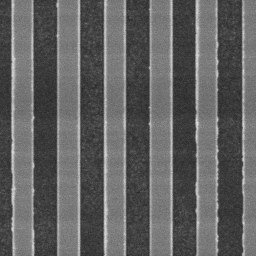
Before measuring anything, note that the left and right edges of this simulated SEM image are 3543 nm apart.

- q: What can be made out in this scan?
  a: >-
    lines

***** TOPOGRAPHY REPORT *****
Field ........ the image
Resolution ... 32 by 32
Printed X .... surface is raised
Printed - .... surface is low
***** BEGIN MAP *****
--XX---XXX---XXX---XX----XX---XX
--XX---XXX---XXX---XX----XX---XX
--XX---XXX---XXX---XX----XX---XX
--XX---XXX---XXX---XX----XX---XX
--XX---XXX---XXX---XX----XX---XX
--XX---XXX---XXX---XX----XX---XX
--XX---XXX---XXX---XX----XX---XX
--XX---XXX---XXX---XX----XX---XX
--XX---XXX---XXX---XX----XX---XX
--XX---XXX---XXX---XX----XX---XX
--XX---XXX---XXX---XX----XX---XX
--XX---XXX---XXX---XX----XX---XX
--XX---XXX---XXX---XX----XX---XX
--XX---XXX---XXX---XX----XX---XX
--XX---XXX---XXX---XX----XX---XX
--XX---XXX---XXX---XX----XX---XX
--XX---XXX---XXX---XX----XX---XX
--XX---XXX---XXX---XX----XX---XX
--XX---XXX---XXX---XX----XX---XX
--XX---XXX---XXX---XX----XX---XX
--XX---XXX---XXX---XX----XX---XX
--XX---XXX---XXX---XX----XX---XX
--XX---XXX---XXX---XX----XX---XX
--XX---XXX---XXX---XX----XX---XX
--XX---XXX---XXX---XX----XX---XX
--XX---XXX---XXX---XX----XX---XX
--XX---XXX---XXX---XX----XX---XX
--XX---XXX---XXX---XX----XX---XX
--XX---XXX---XXX---XX----XX---XX
--XX---XXX---XXX---XX----XX---XX
--XX---XXX---XXX---XX----XX---XX
--XX---XXX---XXX---XX----XX---XX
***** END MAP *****